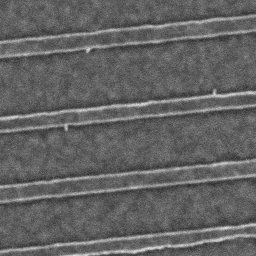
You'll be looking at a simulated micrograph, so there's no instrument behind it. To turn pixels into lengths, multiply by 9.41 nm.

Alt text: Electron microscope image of one or a few lines or trenches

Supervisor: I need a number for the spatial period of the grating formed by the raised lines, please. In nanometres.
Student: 657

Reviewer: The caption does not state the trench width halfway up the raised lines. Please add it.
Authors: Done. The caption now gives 510 nanometers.